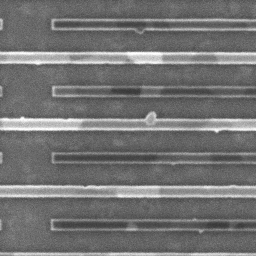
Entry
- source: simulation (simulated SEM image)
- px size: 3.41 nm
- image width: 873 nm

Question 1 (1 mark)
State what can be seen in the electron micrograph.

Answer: parallel lines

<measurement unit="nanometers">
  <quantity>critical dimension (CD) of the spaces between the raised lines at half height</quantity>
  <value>81.1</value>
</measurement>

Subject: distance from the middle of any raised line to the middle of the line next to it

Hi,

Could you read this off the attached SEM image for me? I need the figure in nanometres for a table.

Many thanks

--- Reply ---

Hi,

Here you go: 114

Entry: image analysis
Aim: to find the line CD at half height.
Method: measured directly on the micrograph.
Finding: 34.6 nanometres